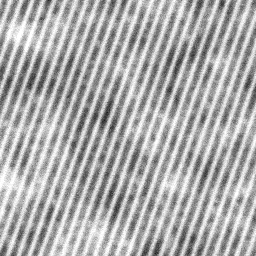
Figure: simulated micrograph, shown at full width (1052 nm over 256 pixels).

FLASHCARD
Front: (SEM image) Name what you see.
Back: parallel lines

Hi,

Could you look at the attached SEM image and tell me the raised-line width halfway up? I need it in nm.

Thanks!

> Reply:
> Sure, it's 12.1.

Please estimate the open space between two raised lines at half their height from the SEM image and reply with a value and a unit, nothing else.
30.1 nm